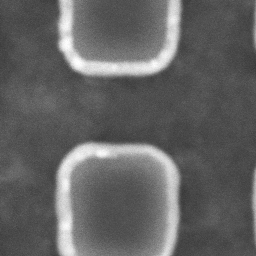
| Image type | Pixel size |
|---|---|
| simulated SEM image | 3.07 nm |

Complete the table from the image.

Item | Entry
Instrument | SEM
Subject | raised bodies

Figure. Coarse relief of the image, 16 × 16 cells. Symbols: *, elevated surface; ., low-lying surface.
....*******.....
....*******.....
....*******.....
....*******.....
................
................
................
................
................
.....*****......
....*******.....
....*******.....
....*******.....
....*******.....
....*******.....
....*******.....